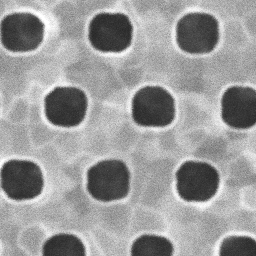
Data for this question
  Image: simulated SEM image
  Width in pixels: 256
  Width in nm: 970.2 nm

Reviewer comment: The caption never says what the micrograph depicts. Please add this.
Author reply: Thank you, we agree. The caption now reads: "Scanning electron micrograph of holes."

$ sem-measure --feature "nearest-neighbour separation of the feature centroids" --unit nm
325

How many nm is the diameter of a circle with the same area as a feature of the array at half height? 169